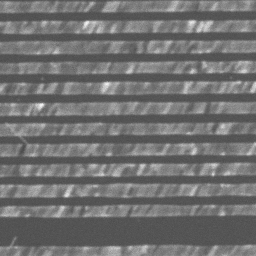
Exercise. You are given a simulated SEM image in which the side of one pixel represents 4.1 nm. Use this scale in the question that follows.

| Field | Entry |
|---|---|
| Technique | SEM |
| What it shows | wiring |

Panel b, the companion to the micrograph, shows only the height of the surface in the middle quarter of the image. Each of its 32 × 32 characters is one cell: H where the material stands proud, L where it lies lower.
HHHHHHHHHHHHHHHHHHHHHHHHHHHHHHHH
HHHHHHHHHHHHHHHHHHHHHHHHHHHHHHHH
LLLLLLLLLLLLLLLLLLLLLLLLLLLLLLLL
LLLLLLLLLLLLLLLLLLLLLLLLLLLLLLLL
LLLLLLLLLLLLLLLLLLLLLLLLLLLLLLHH
HHHHHHHHHHHHHLHHHHHHHHHHHHHHHHHH
HHHHHHHHHHHHHHHHHHHHHHHHHHHHHHHH
HHLLLLLLLLLLLHHHHHHLLLLLLLLLLLLL
LLLLLLLLLLLLLLLLLLLLLLLLLLLLLLLL
LLLLLLLLLLLLLLLLLLLLLLLLLLLLLLLL
HHHHHHHHHHHHHHHHHHHHHHHHHHHHHHHH
HHHHHHHHHHHHHHHHHHHHHHHHHHHHHHHH
HHHHHHHHHHHHHLLLLLLLLLLLLLLLLLLL
LLLLLLLLLLLLLLLLLLLLLLLLLLLLLLLL
LLLLLLLLLLLLLLLLLLLLLLLLLLLLLLLL
HHHHHHHHHHHHHHHHHHHHHHHHHHHHHHHH
HHHHHHHHHHHHHHHHHHHHHHHHHHHHHHHH
HHHHHHHHHHHHHHHHHHHHHHHHLLLLLLLL
LLLLLLLLLLLLLLLLLLLLLLLLLLLLLLLL
LLLLLLLLLLLLLLLLLLLLLLLLLLLLLLLL
HHHHHHHHHHHHHHHHHHHHHHHHHHHHHHHH
HHHHHHHHHHHHHHHHHHHHHHHHHHHHHHHH
HHHHHHHHHHHHHHHHHHHHHHHHHHHHHHLL
LLLLLLLLLLLLLLLLLLLLLLLLLLLLLLLL
LLLLLLLLLLLLLLLLLLLLLLLLLLLLLLLL
HHHHHHHHHHHHHHLHHHHHHHHHHHHHHHHH
HHHHHHHLHHHHHHHHHHHHHHHHHHHHHHHH
HHHHHHHHHHHHHHHHHHHHHHHHHHHHHHHH
LLLLLLLLLLLLLLLLLLLLLLLLLLLLLLLL
LLLLLLLLLLLLLLLLLLLLLLLLLLLLLLLL
HHHHHHHHHHHHHHHHHHHHHHHHHHHHHHHH
HHHHHHHHHHHHHHHHHHHHHHHHHHHHHHHH